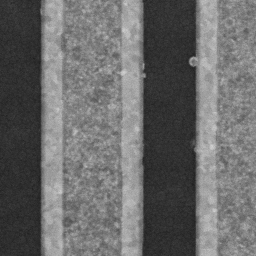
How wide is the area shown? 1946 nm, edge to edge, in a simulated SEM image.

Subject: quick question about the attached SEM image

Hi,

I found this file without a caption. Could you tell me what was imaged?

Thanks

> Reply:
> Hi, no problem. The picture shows one or a few lines or trenches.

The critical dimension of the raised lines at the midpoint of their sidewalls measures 574 nanometres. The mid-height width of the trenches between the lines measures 78.4 pixels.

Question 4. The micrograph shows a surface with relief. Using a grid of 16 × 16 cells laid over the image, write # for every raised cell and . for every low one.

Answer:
...#####.....###
...#####.....###
...#####.....###
...#####.....###
...#####.....###
...#####.....###
...#####.....###
...#####.....###
...#####.....###
...#####.....###
...#####.....###
...#####.....###
...#####.....###
...#####.....###
...#####.....###
...#####.....###